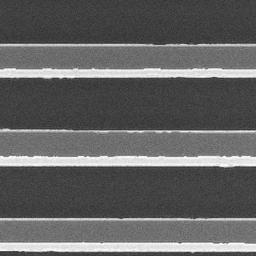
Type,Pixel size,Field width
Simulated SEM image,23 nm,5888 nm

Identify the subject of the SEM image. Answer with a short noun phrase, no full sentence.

lines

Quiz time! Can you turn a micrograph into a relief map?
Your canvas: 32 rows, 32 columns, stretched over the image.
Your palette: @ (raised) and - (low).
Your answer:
--------------------------------
--------------------------------
--------------------------------
--------------------------------
--------------------------------
--------------------------------
@@@@@@@@@@@@@@@@@@@@@@@@@@@@@@@@
@@@@@@@@@@@@@@@@@@@@@@@@@@@@@@@@
@@@@@@@@@@@@@@@@@@@@@@@@@@@@@@@@
@@@@@@@@@@@@@@@@@@@@@@@@@@@@@@@@
--------------------------------
--------------------------------
--------------------------------
--------------------------------
--------------------------------
--------------------------------
@@@@@@@@@@@@@@@@@@@@@@@@@-@@@@@@
@@@@@@@@@@@@@@@@@@@@@@@@@@@@@@@@
@@@@@@@@@@@@@@@@@@@@@@@@@@@@@@@@
@@@@@@@@@@@@@@@@@@@@@@@@@@@@@@@@
@@@@@@@@@@@@@@@@@@@@@@@@@@@@@@@@
--------------------------------
--------------------------------
--------------------------------
--------------------------------
--------------------------------
--------------------------------
@@@@@@@@@@@@@@@@@@@@@@@@@@@@@@@@
@@@@@@@@@@@@@@@@@@@@@@@@@@@@@@@@
@@@@@@@@@@@@@@@@@@@@@@@@@@@@@@@@
@@@@@@@@@@@@@@@@@@@@@@@@@@@@@@@@
--------------------------------